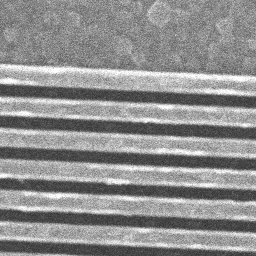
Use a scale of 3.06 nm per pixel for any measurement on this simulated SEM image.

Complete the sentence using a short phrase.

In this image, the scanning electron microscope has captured parallel lines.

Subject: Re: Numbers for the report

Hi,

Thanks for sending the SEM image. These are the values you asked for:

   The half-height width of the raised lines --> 56.9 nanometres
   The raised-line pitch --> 95.1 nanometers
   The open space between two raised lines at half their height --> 12.6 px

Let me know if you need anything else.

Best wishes